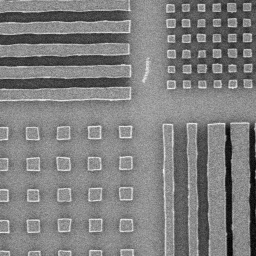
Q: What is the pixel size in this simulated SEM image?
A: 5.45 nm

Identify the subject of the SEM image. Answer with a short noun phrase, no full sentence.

groups of lines, slits or small figures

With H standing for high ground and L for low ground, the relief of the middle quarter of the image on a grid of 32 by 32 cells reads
LLLLLLLLLLLLLHHHHLLLLLLLLLLLLLHH
HHHHHHHHHHHHHHHHHLLLLLLLLLHHLLHH
HHHHHHHHHHHHHHHHHLLLLLLLLLLLLLLL
HHHLLLLLLLLLLLLLLLLLLLLLLLLLLLLL
LLLLLLLLLLLLLLLLLLLLLLLLLLHHLLHL
LLLLLLLLLLLLLLLLLLLLLLLLLLHHLLHL
HHHHHHHHHHHHHHHHHLLLLLLLLLLLLLLL
HHHHHHHHHHHHHHHHHLLLLLLLLLLLLLLL
HHHHHHHHHHHHHHHHHLLLLLLLLLLLLLLL
LLLLLLLLLLLLLLLLLLLLLLLLLLLLLLLL
LLLLLLLLLLLLLLLLLLLLLLLLLLLLLLLL
LLLLLLLLLLLLLLLLLLLLLLLLLLLLLLLL
LLLLLLLLLLLLLLLLLLLLLLLLLLLLLLLL
LLLLLLLLLLLLLLLLLLLLLLLLLLLLLLLL
LLLLLLLLLLLLLLLLLLLLLLLLLLLLLLLL
LLLLLLLLLLLLLLLLLLLLLLLLLHHLLLLH
HLLLLLHHHLLLLLHHHLLLLLLLLHHLLLLH
HLLLLLHHHLLLLLHHHLLLLLLLLHHLLLLH
HLLLLLHHHLLLLLLLLLLLLLLLLHHLLLLH
LLLLLLLLLLLLLLLLLLLLLLLLLHHLLLLH
LLLLLLLLLLLLLLLLLLLLLLLLLHHLLLLH
LLLLLLLLLLLLLLLLLLLLLLLLLHHLLLLH
LLLLLLLLLLLLLLLLLLLLLLLLLHHLLLLH
LLLLLLHHLLLLLLHHHLLLLLLLLHHLLLLH
HLLLLLHHHLLLLLHHHLLLLLLLLHHLLLLH
HLLLLLHHHLLLLLHHHLLLLLLLLHHLLLLH
HLLLLLLLLLLLLLLLLLLLLLLLLHHLLLLH
LLLLLLLLLLLLLLLLLLLLLLLLLHHLLLLH
LLLLLLLLLLLLLLLLLLLLLLLLLHHLLLLH
LLLLLLLLLLLLLLLLLLLLLLLLLHHLLLLH
LLLLLLLLLLLLLLLLLLLLLLLLLHHLLLLH
HLLLLLHHHLLLLLHHHLLLLLLLLHHLLLLH